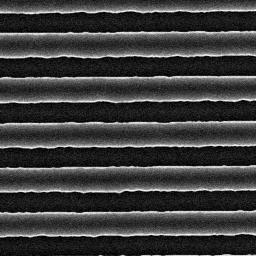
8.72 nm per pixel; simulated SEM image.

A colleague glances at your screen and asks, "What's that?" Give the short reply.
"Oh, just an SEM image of lines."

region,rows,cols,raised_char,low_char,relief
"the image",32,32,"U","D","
UUUUUUUUUUUUUUUUUUUUUUUUUUUUUUUU
UUUUUUUUUDDUDDUDDUUDDDDDDDDDDDDD
DDDDDDDDDDDDDDDDDDDDDDDDDDDDDDDD
DDDDDDDDDDDDDDDDDDDDDDDDDDDDDDDD
UUUUUUUUUUUUUUUUUUUUUUUUUUUUUUUU
UUUUUUUUUUUUUUUUUUUUUUUUUUUUUUUU
UUUUUUUUUUUUUUUUUUUUUUUUUUUUUUUU
DDDDDDDDDDDDDDDDDDDDDDDDDDDDDDDD
DDDDDDDDDDDDDDDDDDDDDDDDDDDDDDDD
DDDDDDDDDDDDDDDDDDDDDDDDDDDDDDDD
UUUUUUUUUUUUUUUUUUUUUUUUUUUUUUUU
UUUUUUUUUUUUUUUUUUUUUUUUUUUUUUUU
UUUUUUUUUUUUUUUUUUUUUUUUUDUUUUDU
DDDDDDDDDDDDDDDDDDDDDDDDDDDDDDDD
DDDDDDDDDDDDDDDDDDDDDDDDDDDDDDDD
UUUUUUUUUUUUUUUUUUUUUUUUUUUUUUUU
UUUUUUUUUUUUUUUUUUUUUUUUUUUUUUUU
UUUUUUUUUUUUUUUUUUUUUUUUUUUUUUUU
DDDDDDDDDDDDDDDDDDDDDDDDDDDDDDDD
DDDDDDDDDDDDDDDDDDDDDDDDDDDDDDDD
DDDDDDDDDDDDDDDDDDDDDDDDDDDDDDDD
UUUUUUUUUUUUUUUUUUUUUUUUUUUUUUUU
UUUUUUUUUUUUUUUUUUUUUUUUUUUUUUUU
UUUUUUUUUUUUUUUUUUUUUUUUUUUUUUUU
DDDDDDDDDDDDDDDDDDDDDDDDDDDDDDDD
DDDDDDDDDDDDDDDDDDDDDDDDDDDDDDDD
DDDDDDDDDDDDDDDDUUUUUUUUUUUUUUUU
UUUUUUUUUUUUUUUUUUUUUUUUUUUUUUUU
UUUUUUUUUUUUUUUUUUUUUUUUUUUUUUUU
UDDUDDDDDDDUDDDDDDDDDDDDDDDDDDDD
DDDDDDDDDDDDDDDDDDDDDDDDDDDDDDDD
DDDDDDDDDDDDDDDDDDDDDDDDDDDDDDDD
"